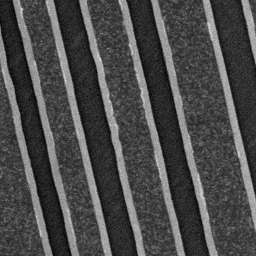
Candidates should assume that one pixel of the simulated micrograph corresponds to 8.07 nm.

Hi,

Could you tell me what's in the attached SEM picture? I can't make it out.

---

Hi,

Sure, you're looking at one or a few lines or trenches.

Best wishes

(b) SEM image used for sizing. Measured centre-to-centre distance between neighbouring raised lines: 574 nanometres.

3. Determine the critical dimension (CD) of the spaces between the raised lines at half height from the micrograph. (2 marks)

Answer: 0.257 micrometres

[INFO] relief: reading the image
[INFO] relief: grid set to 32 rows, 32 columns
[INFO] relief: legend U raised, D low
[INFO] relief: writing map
DDUUUUDDDDUUUUUDDDDUUUUUUUDDDDDU
DDUUUUUDDDDUUUUUDDDDUUUUUUDDDDDU
DDDUUUUDDDDUUUUUDDDDUUUUUUDDDDDU
DDDUUUUDDDDUUUUUDDDDUUUUUUUDDDDU
DDDUUUUDDDDUUUUUDDDDUUUUUUUDDDDD
DDDUUUUDDDDDUUUUUDDDDUUUUUUDDDDD
DDDDUUUUDDDDUUUUUDDDDUUUUUUDDDDD
DDDDUUUUDDDDUUUUUDDDDUUUUUUDDDDD
UDDDUUUUDDDDDUUUUDDDDUUUUUUUDDDD
UDDDUUUUDDDDDUUUUUDDDDUUUUUUDDDD
UDDDDUUUUDDDDUUUUUDDDDUUUUUUDDDD
UDDDDUUUUDDDDUUUUUDDDDUUUUUUDDDD
UUDDDUUUUDDDDUUUUUDDDDUUUUUUUDDD
UUDDDUUUUDDDDDUUUUDDDDUUUUUUUDDD
UUDDDDUUUUDDDDUUUUUDDDDUUUUUUDDD
UUDDDDUUUUDDDDUUUUUDDDDUUUUUUDDD
UUDDDDUUUUDDDDUUUUUDDDDUUUUUUUDD
UUUDDDUUUUDDDDDUUUUDDDDUUUUUUUDD
UUUDDDUUUUDDDDDUUUUUDDDDUUUUUUDD
UUUDDDDUUUUDDDDUUUUUDDDDUUUUUUDD
UUUDDDDUUUUDDDDUUUUUDDDDUUUUUUDD
UUUUDDDUUUUDDDDUUUUUDDDDUUUUUUUD
UUUUDDDUUUUDDDDDUUUUUDDDDUUUUUUD
UUUUDDDDUUUUDDDDUUUUUDDDDUUUUUUD
UUUUDDDDUUUUDDDDUUUUUDDDDUUUUUUD
UUUUUDDDUUUUDDDDUUUUUDDDDUUUUUUU
UUUUUDDDUUUUDDDDDUUUUDDDDUUUUUUU
UUUUUDDDUUUUUDDDDUUUUUDDDDUUUUUU
UUUUUDDDDUUUUDDDDUUUUUDDDDUUUUUU
UUUUUDDDDUUUUDDDDUUUUUDDDDUUUUUU
UUUUUUDDDUUUUDDDDUUUUUDDDDUUUUUU
UUUUUUDDDUUUUDDDDDUUUUUDDDDUUUUU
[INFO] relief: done